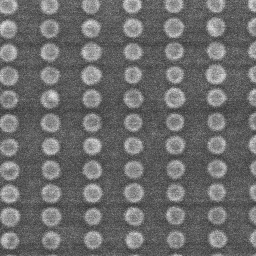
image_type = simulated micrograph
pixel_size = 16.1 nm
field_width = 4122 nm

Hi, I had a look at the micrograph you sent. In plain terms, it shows a regular array of raised bodies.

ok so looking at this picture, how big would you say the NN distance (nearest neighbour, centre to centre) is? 372 nm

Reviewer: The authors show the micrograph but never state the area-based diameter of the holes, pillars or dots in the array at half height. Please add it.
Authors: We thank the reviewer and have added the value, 270 nm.